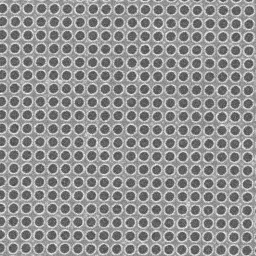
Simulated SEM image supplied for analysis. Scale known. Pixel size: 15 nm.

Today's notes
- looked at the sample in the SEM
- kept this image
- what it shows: a regular array of holes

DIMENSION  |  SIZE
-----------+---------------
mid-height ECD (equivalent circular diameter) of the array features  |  10.1 px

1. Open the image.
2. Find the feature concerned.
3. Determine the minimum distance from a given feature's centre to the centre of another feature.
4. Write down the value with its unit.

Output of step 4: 0.193 microns